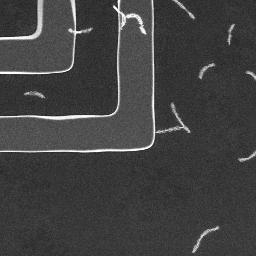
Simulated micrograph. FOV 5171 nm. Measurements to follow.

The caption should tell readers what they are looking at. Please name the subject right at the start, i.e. groups of lines, slits or small figures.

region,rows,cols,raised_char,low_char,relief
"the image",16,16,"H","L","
LLLHHLLHHHLLLLLL
LLHHHLLHHHLLLLLL
HHHHHLLHHHLLLLLL
HHHHHLLHHHLLLLLL
HHHHLLLHHHLLLLLL
LLLLLLLHHHLLLLLL
LLLLLLLHHHLLLLLL
HHHHHHHHHHLLLLLL
HHHHHHHHHHLLLLLL
LLLLLLLLLLLLLLLL
LLLLLLLLLLLLLLLL
LLLLLLLLLLLLLLLL
LLLLLLLLLLLLLLLL
LLLLLLLLLLLLLLLL
LLLLLLLLLLLLLLLL
LLLLLLLLLLLLLLLL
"